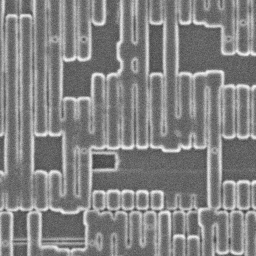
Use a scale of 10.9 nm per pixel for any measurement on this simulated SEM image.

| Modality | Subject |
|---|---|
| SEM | wiring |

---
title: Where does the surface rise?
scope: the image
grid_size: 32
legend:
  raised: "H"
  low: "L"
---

LLLLHHHHHHHHHLLHHHHHHHHHHHHHHHHH
HLLLHHHHHHHHHLLHHHHHHHHHHHHHHHHH
HHHHHHHHHHHHHLLHHHHHHHHHHHHHHHHH
HHHHHHHHHHHLLLLHHHLLHHLLLLLHHHHH
HHHHHHHHHHHLLLLHHHLLHHLLLLLLHHHH
HHHHHHHHHHHLLLLHHHLLHHLLLLLLHHHH
HHHHHHHHHHHLLLLHHHLLHHLLLLLLHHHH
HHHHHHHHHLLLLLLHHHLLHHLLLLLLLLLL
HHHHHHHHLLLLLLLHHHLLHHLLLLLLLLLL
HHHHHHHHLLLLHLHHHHHHHHHHHHHHLLLL
HHHHHHHHLLLLHHHHHHHHHHHHHHHHLLLL
HHHHHHHHLLLLHHHHHHHHHHHHHHHHHHHH
HHHHHHHHHHHHHHHHHHHHHHHHHHHHHHHH
HHHHHHHHHHHHHHHHHHHHHHHHHHHHHHHH
HHHHHHHHHHHHHHHHHHHHHHHHHHHHHHHH
HHHHHHHHHHHHHHHHHHHHHHHHHHHHHHHH
HHHHHHHHHHHHHHHHHHHHHHHHHHHHHHHH
LHHHLLLLHHHHHHHHHHHHHHHHHHHHLLLL
LHHHLLLLHHHHHHHHLLLLHHHLLHHHLLLL
LHHHLLLLHHHLLLLLLLLLLLLLLLHHLLLL
LHHHLLLLHHHLLLLLLLLLLLLLLLHHLLLL
HHHHHHHLHHHLLLLLLLLLLLLLLLHHLLLL
HHHHHHHHHHHLLLLLLLLLLLLLLLHHLLLL
HHHHHHHHHHHLLLLLLLLLLLLLLLHHHHHH
HHHHHHHHHHHHHHHHHHHHLLLLLLHHHHHH
HHHHHHHHHHHHHHHHHHHHLLLLLLHHHHHH
HHLHHLLLHHHHHHHHHHHHHLLLLHHHHHHH
HHLLHLLLLLLHHHHHHHHHHLLLLHHHHHHH
HHLLHLLLLLLHHHHHHHHHHLLLLHHHHHHH
HLLLHLLLLLLHHHHHHHHHHHHLLHHHHHHH
HLLLHLLLLLLHHHHHHHHHHHHHHHHHHHHH
HHLLHHHHHHHHHHHHHHHHHHHHHHHHHHHH